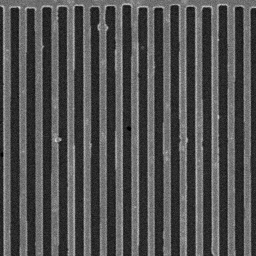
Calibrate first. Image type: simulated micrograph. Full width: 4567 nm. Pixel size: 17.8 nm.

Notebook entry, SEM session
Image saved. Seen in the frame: parallel lines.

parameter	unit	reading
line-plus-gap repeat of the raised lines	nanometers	286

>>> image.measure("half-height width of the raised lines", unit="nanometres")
107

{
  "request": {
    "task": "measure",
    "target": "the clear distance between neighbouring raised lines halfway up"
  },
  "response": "183 nm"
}